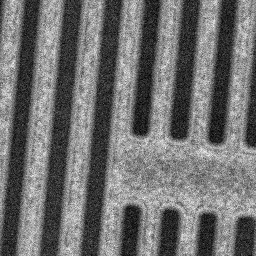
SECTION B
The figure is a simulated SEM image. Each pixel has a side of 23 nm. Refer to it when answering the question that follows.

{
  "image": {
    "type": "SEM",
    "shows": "parallel lines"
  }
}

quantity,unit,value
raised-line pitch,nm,908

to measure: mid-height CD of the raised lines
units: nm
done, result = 395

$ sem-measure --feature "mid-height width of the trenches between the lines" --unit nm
518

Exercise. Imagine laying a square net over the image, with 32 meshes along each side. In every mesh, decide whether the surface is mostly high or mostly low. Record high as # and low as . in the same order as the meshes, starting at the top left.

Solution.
.##..###...##...##..##...##...##
.##..###..###..###..##...##...##
###..##...###..###..##...##...##
##...##...##...##...##...##...##
##...##...##...##...##...##...##
##...##...##...##...##...##..##.
##...##...##...##...##...##..##.
##...##...##...##...##...##..##.
##...##...##...##...##...##..##.
##...##...##...##..###..##...##.
##..###...##...##..###..##...##.
##..###...##...##..##...##...##.
##..##...###..###..##...##...##.
#...##...##...##...##...##...##.
#...##...##...##...##...##...##.
#...##...##...##...##...##..##..
#...##...##...##...##...##..##..
#...##...##...#######..###..##..
#...##...##...#################.
#...##...##...##################
#..###...##...##################
#..###...##...##################
#..##...###..###################
...##...##...###################
...##...##...###################
...##...##...###.###############
...##...##...##...##...##..#####
...##...##...##...##...##..##...
...##...##...##...##...##..##...
...##...##...##...##...#...##...
..###...##...##..###..##...##...
..###...##...##..##...##...##...